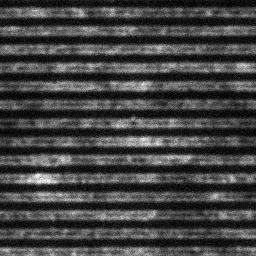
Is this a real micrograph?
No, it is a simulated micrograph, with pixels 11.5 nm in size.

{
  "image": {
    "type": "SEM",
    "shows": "parallel lines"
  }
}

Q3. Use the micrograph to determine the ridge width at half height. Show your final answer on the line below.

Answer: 80.8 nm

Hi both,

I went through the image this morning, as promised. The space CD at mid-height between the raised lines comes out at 0.127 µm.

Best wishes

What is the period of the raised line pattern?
0.213 microns